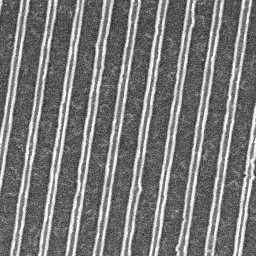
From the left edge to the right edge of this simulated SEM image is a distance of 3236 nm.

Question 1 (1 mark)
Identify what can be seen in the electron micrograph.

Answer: parallel lines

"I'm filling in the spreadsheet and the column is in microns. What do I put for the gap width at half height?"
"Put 0.266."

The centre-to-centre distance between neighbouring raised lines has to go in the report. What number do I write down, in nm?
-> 347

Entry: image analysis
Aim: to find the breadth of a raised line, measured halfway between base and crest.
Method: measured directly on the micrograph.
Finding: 89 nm